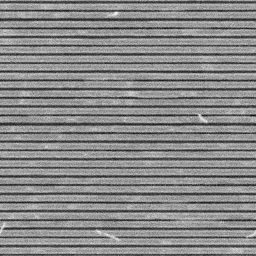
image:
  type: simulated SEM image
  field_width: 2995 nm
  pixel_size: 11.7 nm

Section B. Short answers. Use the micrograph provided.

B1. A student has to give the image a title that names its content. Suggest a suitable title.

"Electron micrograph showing parallel lines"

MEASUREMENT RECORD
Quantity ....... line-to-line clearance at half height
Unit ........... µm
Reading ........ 0.0307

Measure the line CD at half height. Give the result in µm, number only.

0.0716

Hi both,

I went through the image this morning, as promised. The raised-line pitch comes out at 102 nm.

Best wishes